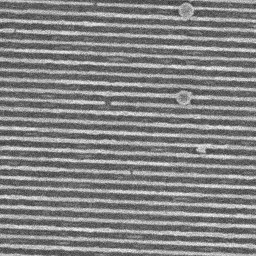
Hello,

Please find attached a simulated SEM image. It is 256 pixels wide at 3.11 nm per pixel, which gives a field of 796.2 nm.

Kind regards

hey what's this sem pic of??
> parallel lines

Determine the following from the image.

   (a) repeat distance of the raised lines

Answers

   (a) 30.4 nm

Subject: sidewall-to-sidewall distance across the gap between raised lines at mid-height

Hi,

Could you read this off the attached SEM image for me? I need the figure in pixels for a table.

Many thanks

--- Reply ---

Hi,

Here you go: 6.62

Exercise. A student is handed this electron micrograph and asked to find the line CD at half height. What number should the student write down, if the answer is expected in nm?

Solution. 8.9